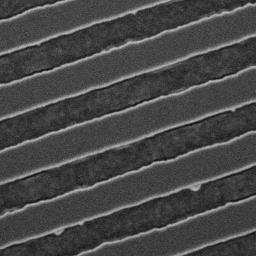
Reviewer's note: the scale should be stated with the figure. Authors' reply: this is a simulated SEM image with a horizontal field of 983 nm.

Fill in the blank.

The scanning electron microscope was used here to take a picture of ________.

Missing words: lines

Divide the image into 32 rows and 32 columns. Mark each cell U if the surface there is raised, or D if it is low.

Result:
DDDDDDDUUUUUUUUUUUUUDDDDDDDDDDDU
DDDUUUUUUUUUUUUUUDDDDDDDDDDDDUUU
UUUUUUUUUUUUUUDDDDDDDDDDDUUUUUUU
UUUUUUUUUUUDDDDDDDDDDDUUUUUUUUUU
UUUUUUUDDDDDDDDDDDDUUUUUUUUUUUUU
UUUUUDDDDDDDDDDDUUUUUUUUUUUUUDDD
UDDDDDDDDDDDDUUUUUUUUUUUUUDDDDDD
DDDDDDDDDDUUUUUUUUUUUUUDDDDDDDDD
DDDDDDDUUUUUUUUUUUUUDDDDDDDDDDDU
DDDDUUUUUUUUUUUUUDDDDDDDDDDDUUUU
UUUUUUUUUUUUUUDDDDDDDDDDDUUUUUUU
UUUUUUUUUUUDDDDDDDDDDDDUUUUUUUUU
UUUUUUUUDDDDDDDDDDDUUUUUUUUUUUUU
UUUUUDDDDDDDDDDDUUUUUUUUUUUUUUDD
UUDDDDDDDDDDDUUUUUUUUUUUUUDDDDDD
DDDDDDDDDDUUUUUUUUUUUUUDDDDDDDDD
DDDDDDUUUUUUUUUUUUUUDDDDDDDDDDDU
DDDDUUUUUUUUUUUUUDDDDDDDDDDDDUUU
DUUUUUUUUUUUUUDDDDDDDDDDDUUUUUUU
UUUUUUUUUUUDDDDDDDDDDDUUUUUUUUUU
UUUUUUUUDDDDDDDDDDDUUUUUUUUUUUUU
UUUUUDDDDDDDDDDDUUUUUUUUUUUUUUDD
UUDDDDDDDDDDDUUUUUUUUUUUUUUDDDDD
DDDDDDDDDDDUUUUUUUUUUUUDUDDDDDDD
DDDDDDDUUUUUUUUUUUUUUDDDDDDDDDDD
DDDDUUUUUUUUUUUUUUDDDDDDDDDDUUUU
DUUUUUUUUUUUUUDDDDDDDDDDDDUUUUUU
UUUUUUUUUUUDDDDDDDDDDDDUUUUUUUUU
UUUUUUUUDDDDDDDDDDDDUUUUUUUUUUUU
UUUUUDDDDDDDDDDDDUUUUUUUUUUUUUDD
UUDDDDDDDDDDDUUUUUUUUUUUUUUDDDDD
DDDDDDDDDDUUUUUUUUUUUUUUDDDDDDDD